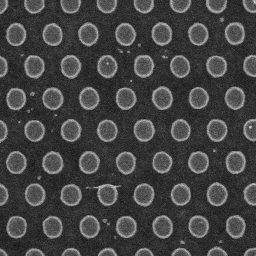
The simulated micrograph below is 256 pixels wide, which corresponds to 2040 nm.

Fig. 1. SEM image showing a regular array of raised bodies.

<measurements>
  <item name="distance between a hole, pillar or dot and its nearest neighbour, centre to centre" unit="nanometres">290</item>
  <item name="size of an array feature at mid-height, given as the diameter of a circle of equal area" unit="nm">164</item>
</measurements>